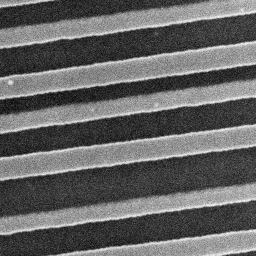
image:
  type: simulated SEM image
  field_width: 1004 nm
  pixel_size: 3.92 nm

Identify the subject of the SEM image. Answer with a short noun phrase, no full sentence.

lines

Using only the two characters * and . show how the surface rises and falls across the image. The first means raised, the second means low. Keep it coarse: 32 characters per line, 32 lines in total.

***......................*******
.................***************
..........***************.......
..****************..............
***********.....................
****..........................**
.......................*********
................****************
.........********************...
.********************...........
**************..............****
******...............***********
...............**************...
.......***************..........
.**************.................
********........................
*........................*******
..................**************
.........*********************..
..********************..........
***************.................
********........................
................................
............................****
.....................***********
.............***************....
.......*************............
*************...................
******..........................
..........................******
..................**************
..........********************..